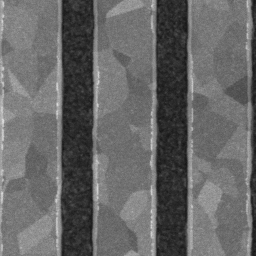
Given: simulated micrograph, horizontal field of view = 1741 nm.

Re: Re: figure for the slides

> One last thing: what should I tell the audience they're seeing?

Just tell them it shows one or a few lines or trenches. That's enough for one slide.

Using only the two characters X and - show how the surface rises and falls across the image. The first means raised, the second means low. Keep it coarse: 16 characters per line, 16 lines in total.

XXXX--XXXX--XXXX
XXXX--XXXX--XXXX
XXXX--XXXX--XXXX
XXXX--XXXX--XXXX
XXXX--XXXX--XXXX
XXXX--XXXX--XXXX
XXXX--XXXX--XXXX
XXXX--XXXX--XXXX
XXXX--XXXX--XXXX
XXXX--XXXX--XXXX
XXXX--XXXX--XXXX
XXXX--XXXX--XXXX
XXXX--XXXX--XXXX
XXXX--XXXX--XXXX
XXXX--XXXX--XXXX
XXXX--XXXX--XXXX